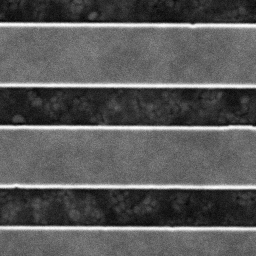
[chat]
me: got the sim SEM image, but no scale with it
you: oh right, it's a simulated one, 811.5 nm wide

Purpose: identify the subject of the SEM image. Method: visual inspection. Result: one or a few lines or trenches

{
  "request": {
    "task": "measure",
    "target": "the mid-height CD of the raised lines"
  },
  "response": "0.199 µm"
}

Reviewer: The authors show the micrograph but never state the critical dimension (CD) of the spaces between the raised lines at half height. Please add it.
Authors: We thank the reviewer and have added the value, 124 nm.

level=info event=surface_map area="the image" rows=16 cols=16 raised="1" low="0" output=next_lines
0000000000000000
1111111110000000
1111111111111111
1111111111111111
1111111111111111
0000000000000000
0000000000000000
0000000000000000
1111111111111111
1111111111111111
1111111111111111
1111111111111111
0000000000000000
0000000000000000
1111111111111111
1111111111111111